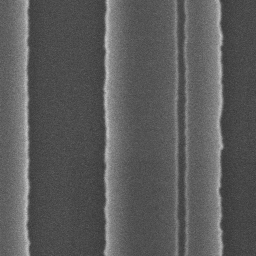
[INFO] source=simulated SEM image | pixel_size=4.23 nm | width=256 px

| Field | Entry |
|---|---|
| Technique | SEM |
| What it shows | lines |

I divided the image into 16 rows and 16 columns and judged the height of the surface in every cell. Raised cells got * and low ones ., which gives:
**.....*******..
**.....*******..
**.....*******..
**.....*******..
**.....*******..
**.....*******..
**.....*******..
**.....*******..
**.....*******..
**.....*******..
**.....*******..
**.....*******..
**.....*******..
**.....*******..
**.....*******..
**.....*******..